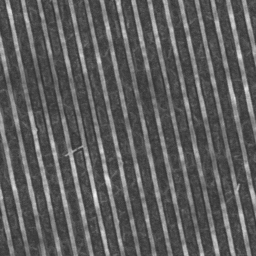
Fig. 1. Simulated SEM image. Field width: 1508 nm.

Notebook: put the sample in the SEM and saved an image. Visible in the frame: parallel lines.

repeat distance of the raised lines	91.1	nm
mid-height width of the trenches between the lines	69.2	nm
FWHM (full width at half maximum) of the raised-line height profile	24.5	nanometers